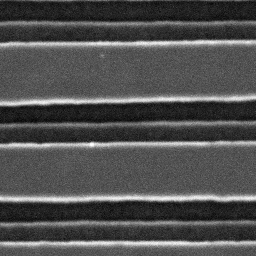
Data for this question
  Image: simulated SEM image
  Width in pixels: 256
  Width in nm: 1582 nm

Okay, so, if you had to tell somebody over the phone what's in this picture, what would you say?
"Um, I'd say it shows lines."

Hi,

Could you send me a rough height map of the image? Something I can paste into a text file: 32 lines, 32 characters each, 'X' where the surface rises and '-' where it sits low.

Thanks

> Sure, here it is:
--------------------------------
--------------------------------
--------------------------------
--------------------------------
--------------------------------
XXXXXXXXXXXXXXXXXXXXXXXXXXXXXXXX
XXXXXXXXXXXXXXXXXXXXXXXXXXXXXXXX
XXXXXXXXXXXXXXXXXXXXXXXXXXXXXXXX
XXXXXXXXXXXXXXXXXXXXXXXXXXXXXXXX
XXXXXXXXXXXXXXXXXXXXXXXXXXXXXXXX
XXXXXXXXXXXXXXXXXXXXXXXXXXXXXXXX
XXXXXXXXXXXXXXXXXXXXXXXXXXXXXXXX
XXXXXXXXXXXXXXXXXXX-------------
--------------------------------
--------------------------------
--------------------------------
--------------------------------
--------------------------------
XXXXXXXXXXXXXXXXXXXXXXXXXXXXXXXX
XXXXXXXXXXXXXXXXXXXXXXXXXXXXXXXX
XXXXXXXXXXXXXXXXXXXXXXXXXXXXXXXX
XXXXXXXXXXXXXXXXXXXXXXXXXXXXXXXX
XXXXXXXXXXXXXXXXXXXXXXXXXXXXXXXX
XXXXXXXXXXXXXXXXXXXXXXXXXXXXXXXX
XXXXXXXXXXXXXXXXXXXXXXXXXXXXXXXX
--------------------------------
--------------------------------
--------------------------------
--------------------------------
--------------------------------
XXXXXXXXXXXXXXXXXXXXXXXXXXXXXXXX
XXXXXXXXXXXXXXXXXXXXXXXXXXXXXXXX